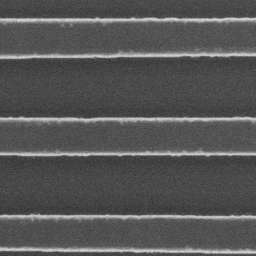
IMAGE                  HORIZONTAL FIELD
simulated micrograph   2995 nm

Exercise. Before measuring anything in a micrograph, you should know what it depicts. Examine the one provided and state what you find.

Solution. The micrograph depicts lines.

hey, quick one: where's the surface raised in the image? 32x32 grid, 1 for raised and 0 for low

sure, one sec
00000000000000000000000000000000
00000000000000000000000000000000
11111111111111111111111111111111
11111111111111111111111111111111
11111111111111111111111111111111
11111111111111111111111111111111
11111111111111111111111111111111
00000000000000000000000000000000
00000000000000000000000000000000
00000000000000000000000000000000
00000000000000000000000000000000
00000000000000000000000000000000
00000000000000000000000000000000
00000000000000000000000000000000
00000000000000000000000000000000
11111111111111111111111111111111
11111111111111111111111111111111
11111111111111111111111111111111
11111111111111111111111111111111
00000000000000000000000000000000
00000000000000000000000000000000
00000000000000000000000000000000
00000000000000000000000000000000
00000000000000000000000000000000
00000000000000000000000000000000
00000000000000000000000000000000
00000000000000000000000000000000
11111111111111111111111111111111
11111111111111111111111111111111
11111111111111111111111111111111
11111111111111111111111111111111
00000000000000000000000000011111